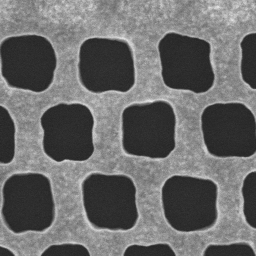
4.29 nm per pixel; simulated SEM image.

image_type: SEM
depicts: holes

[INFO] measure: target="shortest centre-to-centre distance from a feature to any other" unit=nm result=332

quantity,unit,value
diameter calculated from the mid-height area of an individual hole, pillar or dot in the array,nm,251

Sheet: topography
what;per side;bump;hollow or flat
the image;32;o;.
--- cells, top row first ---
oooooooooooooooooooooooooooooooo
oooooooooooooooooooooooooooooooo
oooooooooooooooooooooooooooooooo
oooooooooooooooooooooooooooooooo
oo...oooooooooooooooo..oooooooo.
......oooo......oooo......oooo..
.......ooo......oooo......oooo..
.......ooo.......ooo......oooo..
.......ooo.......ooo.......ooo..
.......ooo.......ooo.......ooo..
o.....oooo.......oooo......oooo.
ooooooooooo.oooooooooooo.ooooooo
oooooooooooooooooooooooooooooooo
.ooooo.....ooooo......oooo.....o
.oooo.......ooo.......ooo.......
..ooo.......ooo.......ooo.......
..ooo.......ooo.......ooo.......
..ooo.......ooo.......oooo......
..ooo.......ooo.......oooo......
..oooo.....ooooooo...oooooo....o
oooooooooooooooooooooooooooooooo
oooooooooooooooooooooooooooooooo
o.....ooooo.....ooooo.....ooooo.
......oooo.......ooo.......ooo..
.......ooo.......ooo.......ooo..
.......ooo.......ooo.......ooo..
.......oooo......ooo.......ooo..
.......oooo......oooo......oooo.
o.....oooooo....oooooo....oooooo
oooooooooooooooooooooooooooooooo
oooooooo..oooooooooo.oooooooo..o
.oooo......ooooo......oooo......